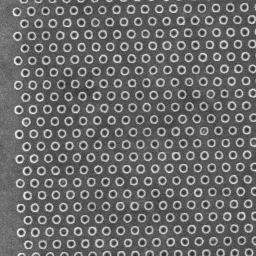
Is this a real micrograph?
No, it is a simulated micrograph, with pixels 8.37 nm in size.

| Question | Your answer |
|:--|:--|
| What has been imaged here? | a regular array of raised bodies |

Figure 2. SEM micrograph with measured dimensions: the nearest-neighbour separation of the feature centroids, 116 nanometers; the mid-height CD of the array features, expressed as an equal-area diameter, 0.0661 um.